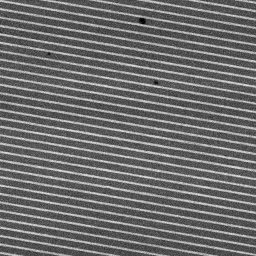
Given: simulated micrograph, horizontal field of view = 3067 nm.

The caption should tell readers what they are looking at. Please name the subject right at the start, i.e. parallel lines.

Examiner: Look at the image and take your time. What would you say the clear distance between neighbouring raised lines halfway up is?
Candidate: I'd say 81.1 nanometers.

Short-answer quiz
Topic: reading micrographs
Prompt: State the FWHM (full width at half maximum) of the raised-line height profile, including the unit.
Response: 0.0177 um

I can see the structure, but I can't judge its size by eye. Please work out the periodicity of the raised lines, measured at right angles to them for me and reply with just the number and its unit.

99.2 nm